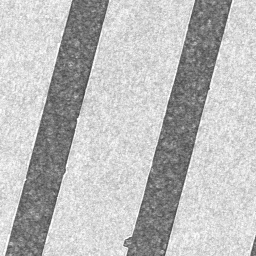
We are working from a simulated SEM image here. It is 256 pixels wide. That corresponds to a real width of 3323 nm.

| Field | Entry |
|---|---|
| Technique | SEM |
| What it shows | one or a few lines or trenches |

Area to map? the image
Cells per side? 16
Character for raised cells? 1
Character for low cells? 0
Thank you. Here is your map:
1111000111110011
1111001111110011
1111001111110011
1111001111100011
1110001111100111
1110011111100111
1110011111000111
1110011111000111
1100011111001111
1100111111001111
1100111110001111
1100111110001111
1000111110011111
1001111110011111
1001111100011111
0001111100111111